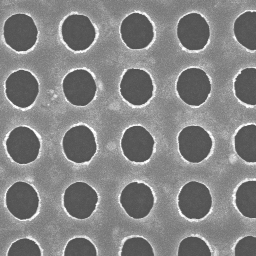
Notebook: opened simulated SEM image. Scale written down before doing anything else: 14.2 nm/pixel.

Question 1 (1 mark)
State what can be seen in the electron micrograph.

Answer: a regular array of holes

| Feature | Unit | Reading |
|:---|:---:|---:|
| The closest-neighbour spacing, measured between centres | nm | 786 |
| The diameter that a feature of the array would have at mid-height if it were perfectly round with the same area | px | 35.2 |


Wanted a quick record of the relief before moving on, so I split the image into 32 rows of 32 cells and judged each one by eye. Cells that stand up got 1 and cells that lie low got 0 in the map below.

11111111111111111111111111111111
11111111111111111111111111111110
10001111000111100001111000111100
10000111000011100001110000111000
10000111000011100001110000111000
10001111000111110001111000111100
11111111111111111111111111111111
11111111111111111111111111111111
11111111111111111111111101111111
10001111000111100001110000111100
10000111000011100001110000111000
10000111000011100001110000111000
10001111100011110001111000111100
11111111111111111111111111111111
11111111111111111111111111111111
11111111111111111111111111111111
10001111000111110001111000111100
10000111000011100001110000111000
10000111000011100001110000111000
10000111000011110001111000111100
11111111111111111111111111111111
11111111111111111111111111111111
11111111111111111111111111111111
10001111000011100001111000111100
10000111000011100001110000111000
10000111000011100001110000111100
10000111000011110001111000111100
11111111111111111111111111111111
11111111111111111111111111111111
11111111111111111111111111111111
11000111000011110001110000111100
10000111000011100001110000111000